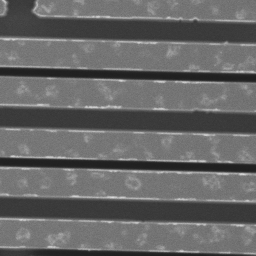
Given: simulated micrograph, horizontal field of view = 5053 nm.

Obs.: parallel lines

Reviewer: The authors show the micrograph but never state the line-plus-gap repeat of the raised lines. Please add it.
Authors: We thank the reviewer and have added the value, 890 nanometers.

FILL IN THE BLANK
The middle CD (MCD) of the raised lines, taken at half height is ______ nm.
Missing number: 614